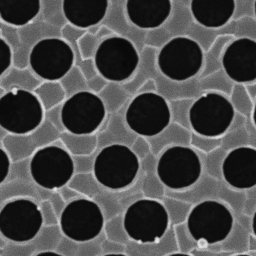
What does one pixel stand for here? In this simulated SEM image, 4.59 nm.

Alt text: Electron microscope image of a regular array of holes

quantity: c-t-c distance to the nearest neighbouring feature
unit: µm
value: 0.283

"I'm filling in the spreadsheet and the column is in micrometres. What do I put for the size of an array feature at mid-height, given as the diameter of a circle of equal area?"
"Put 0.195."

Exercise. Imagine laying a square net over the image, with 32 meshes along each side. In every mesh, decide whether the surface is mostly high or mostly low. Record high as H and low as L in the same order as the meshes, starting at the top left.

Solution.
LLLLLHHHLLLLLHHHLLLLLHHHLLLLLHHH
LLLLLHHHLLLLLHHHLLLLLHHHLLLLLHHH
HLLLHHHHHLLLLHHHLLLLLHHHHLLLHHHH
HHHHHHHHHHHHHHHHHHHHHHHHHHHHHHHH
HHHHHHHHHHHHHHHHHHHHHHHHHHHHHHHH
LHHHHLLLHHHHHLLLHHHHHLLLLHHHHLLL
LHHHLLLLLHHHLLLLLHHHLLLLLHHHLLLL
LHHHLLLLLHHHLLLLLHHHLLLLLHHHLLLL
LHHHLLLLLHHHLLLLLHHHLLLLLHHHLLLL
HHHHHLLLHHHHHLLLHHHHHLLLHHHHHLLL
HHHHHHHHHHHHHHHHHHHHHHHHHHHHHHHH
HHLHHHHHHHLHHHHHHHHHHHHHHHHHHHHH
LLLLLHHHHLLLLHHHHLLLLHHHHLLLHHHH
LLLLLHHHLLLLLHHHLLLLLHHHLLLLLHHH
LLLLLHHHLLLLLHHHLLLLLHHHLLLLLHHH
LLLLLHHHLLLLHHHHLLLLLHHHLLLLLHHH
HHLHHHHHHLLHHHHHHLLLHHHHHLLLHHHH
HHHHHHHHHHHHHHHHHHHHHHHHHHHHHHHH
HHHHHHLHHHHHHLLLHHHHHLLHHHHHHHLH
LHHHLLLLLHHHLLLLLHHHLLLLLHHHLLLL
LHHHLLLLLHHHLLLLLHHHLLLLLHHHLLLL
LHHHLLLLLHHHLLLLLHHHLLLLLHHHLLLL
HHHHLLLLLHHHLLLLLHHHLLLLLHHHLLLL
HHHHHHLHHHHHHHLHHHHHHHHHHHHHHHLH
HHHHHHHHHHHHHHHHHHHHHHHHHHHHHHHH
HLLLHHHHHLLLHHHHHLLLHHHHHLLLHHHH
LLLLLHHHLLLLLHHHLLLLLHHHLLLLLHHH
LLLLLHHHLLLLLHHHLLLLLHHHLLLLLHHH
LLLLLHHHLLLLLHHHLLLLLHHHLLLLLHHH
HLLLHHHHLLLLHHHHLLLLHHHHLLLLHHHH
HHHHHHHHHHHHHHHHHHHHHHHHHHHHHHHH
HHHHHHHHHHHHHHHHHHHHHHHHHHHHHHHH